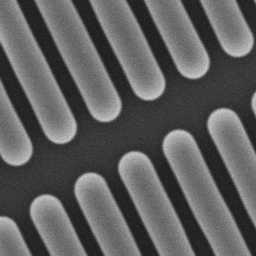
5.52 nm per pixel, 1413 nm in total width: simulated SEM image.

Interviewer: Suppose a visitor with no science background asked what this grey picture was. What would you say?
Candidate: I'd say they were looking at groups of lines, slits or small figures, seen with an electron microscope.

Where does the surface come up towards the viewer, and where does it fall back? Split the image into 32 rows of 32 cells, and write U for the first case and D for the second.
UUDDDUUUUDDUUUUUDDUUUUUDDUUUUUDD
UUUDDUUUUUDDUUUUDDDUUUUDDDUUUUDD
UUUDDDUUUUDDUUUUUDDUUUUUDDUUUUUD
UUUUDDUUUUUDDUUUUUDDUUUUDDDUUUUD
UUUUDDDUUUUDDUUUUUDDUUUUUDDUUUUU
UUUUUDDUUUUUDDUUUUDDDUUUUDDDUUUU
DUUUUDDDUUUUDDUUUUUDDUUUUUDDUUUD
DUUUUUDDUUUUUDDUUUUDDDUUUUDDDDDD
DDUUUUDDUUUUUDDUUUUUDDUUUUDDDDDD
DDUUUUUDDUUUUUDDUUUUDDDUUDDDDDDD
DDDUUUUDDDUUUUDDUUUUUDDDDDDDDDDD
UDDUUUUUDDUUUUUDDUUUDDDDDDDDDDDD
UDDDUUUUDDDUUUUDDDDDDDDDDDDDDDDD
UUDDUUUUUDDUUUUDDDDDDDDDDDDDDDDD
UUDDDUUUUDDDUUUDDDDDDDDDDDUUUUDD
UUUDDUUUUUDDDDDDDDDDDDDDDDUUUUDD
UUUDDUUUUDDDDDDDDDDDDUUDDDUUUUUD
UUUUDDUUUDDDDDDDDDDDDUUUDDDUUUUD
UUUUDDDDDDDDDDDDDDDDUUUUUDDUUUUU
UUUUDDDDDDDDDDDDUUDDDUUUUDDDUUUU
DUUDDDDDDDDDDDDUUUUDDUUUUUDDUUUU
DDDDDDDDDDDDDDDUUUUDDDUUUUDDDUUU
DDDDDDDDDDUUUDDUUUUUDDUUUUUDDUUU
DDDDDDDDDUUUUUDDUUUUDDDUUUUDDDUU
DDDDDUUDDDUUUUDDUUUUUDDUUUUUDDUU
DDDDUUUUDDUUUUUDDUUUUDDDUUUUDDUU
DDDDUUUUDDUUUUUDDUUUUUDDUUUUUDDU
UDDDUUUUUDDUUUUUDDUUUUDDDUUUUDDU
UUDDDUUUUDDUUUUUDDUUUUUDDUUUUUDD
UUUDDUUUUUDDUUUUDDDUUUUDDDUUUUDD
UUUDDDUUUUDDUUUUUDDUUUUUDDUUUUUD
UUUUDDUUUUUDDUUUUDDDUUUUDDDUUUUD